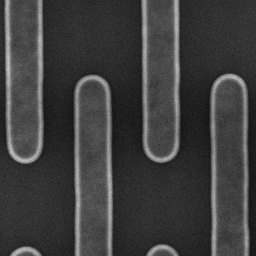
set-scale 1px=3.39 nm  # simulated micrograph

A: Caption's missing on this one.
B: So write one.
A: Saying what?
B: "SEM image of groups of lines, slits or small figures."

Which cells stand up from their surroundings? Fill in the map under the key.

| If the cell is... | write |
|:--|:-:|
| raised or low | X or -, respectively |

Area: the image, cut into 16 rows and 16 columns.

XXX------XX-----
XXX------XX-----
XXX------XX-----
XXX------XX-----
XXX------XX-----
-XX--XX--XX--XX-
-XX--XX--XX--XX-
XXX--XX--XX--XX-
-XX--XX--XX--XX-
-X---XX--XX--XX-
-----XX------XX-
-----XX------XX-
-----XX------XX-
-----XX------XX-
-----XX------XX-
-----XX------XX-